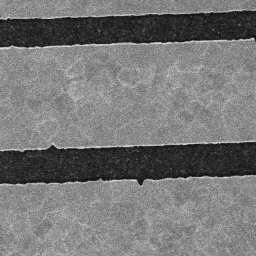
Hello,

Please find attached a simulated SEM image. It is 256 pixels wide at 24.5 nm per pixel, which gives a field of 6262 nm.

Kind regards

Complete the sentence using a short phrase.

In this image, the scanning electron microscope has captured one or a few lines or trenches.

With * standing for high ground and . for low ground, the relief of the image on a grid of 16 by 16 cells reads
****************
................
...............*
****************
****************
****************
****************
****************
****************
................
................
.***************
****************
****************
****************
****************